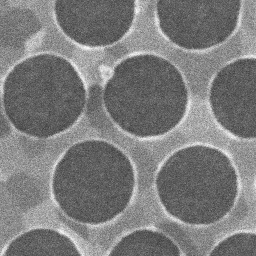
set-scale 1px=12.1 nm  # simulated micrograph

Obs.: holes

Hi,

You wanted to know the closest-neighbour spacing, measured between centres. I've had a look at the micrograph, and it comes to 1.21 µm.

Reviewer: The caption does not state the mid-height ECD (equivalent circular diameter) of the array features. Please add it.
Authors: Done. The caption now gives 1010 nanometers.